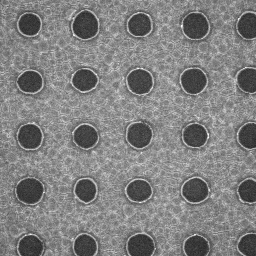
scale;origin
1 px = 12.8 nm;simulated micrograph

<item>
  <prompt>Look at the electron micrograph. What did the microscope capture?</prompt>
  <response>a regular array of raised bodies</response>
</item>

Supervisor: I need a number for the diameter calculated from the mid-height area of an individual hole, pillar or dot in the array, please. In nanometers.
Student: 335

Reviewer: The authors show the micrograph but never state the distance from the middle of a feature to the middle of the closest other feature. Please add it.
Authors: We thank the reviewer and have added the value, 54.2 px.